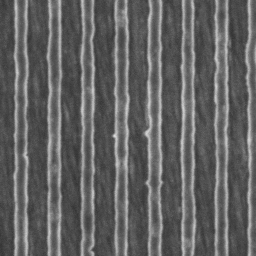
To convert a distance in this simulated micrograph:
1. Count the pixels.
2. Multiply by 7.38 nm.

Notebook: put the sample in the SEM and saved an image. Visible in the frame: parallel lines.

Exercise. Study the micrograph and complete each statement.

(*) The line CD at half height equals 81.2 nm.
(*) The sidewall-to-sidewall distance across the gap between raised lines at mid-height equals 162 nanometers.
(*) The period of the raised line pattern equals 0.246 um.